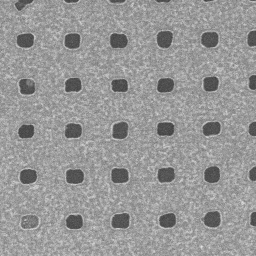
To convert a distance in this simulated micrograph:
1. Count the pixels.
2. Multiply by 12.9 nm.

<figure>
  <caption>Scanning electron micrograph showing a regular array of holes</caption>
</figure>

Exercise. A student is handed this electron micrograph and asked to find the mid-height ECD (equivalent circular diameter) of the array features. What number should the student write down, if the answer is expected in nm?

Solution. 223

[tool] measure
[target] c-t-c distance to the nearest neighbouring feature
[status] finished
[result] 44.5 px